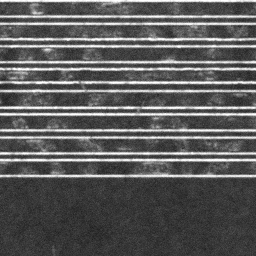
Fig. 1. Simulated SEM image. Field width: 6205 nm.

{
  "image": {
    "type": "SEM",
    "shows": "parallel lines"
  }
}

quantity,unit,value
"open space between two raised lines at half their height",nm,370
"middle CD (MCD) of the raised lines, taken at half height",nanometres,194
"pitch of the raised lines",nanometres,551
